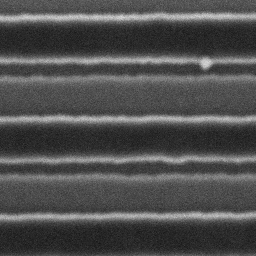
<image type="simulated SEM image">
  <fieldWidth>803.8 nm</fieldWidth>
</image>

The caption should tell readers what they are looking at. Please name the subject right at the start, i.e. lines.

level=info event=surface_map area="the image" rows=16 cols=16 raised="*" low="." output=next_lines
................
****************
****************
****************
................
................
................
****************
****************
****************
................
................
................
****************
****************
****************